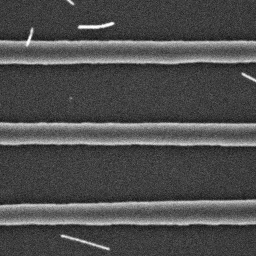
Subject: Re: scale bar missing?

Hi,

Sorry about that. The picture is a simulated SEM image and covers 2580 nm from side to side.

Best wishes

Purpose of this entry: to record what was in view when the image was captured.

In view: lines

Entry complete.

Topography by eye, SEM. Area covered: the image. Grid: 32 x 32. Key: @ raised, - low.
--------------------------------
--------------------------------
--------------------------------
--------------------------------
--------------------------------
@@@@@@@@@@@@@@@@@@@@@@@@@@@@@@@@
@@@@@@@@@@@@@@@@@@@@@@@@@@@@@@@@
@@@@@@@@@@@@@@@@@@@@@@@@@@@@@@@@
--------------------------------
--------------------------------
--------------------------------
--------------------------------
--------------------------------
--------------------------------
--------------------------------
@@@@@@@@@@@@@@@@@@@@@@@@@@@@@-@@
@@@@@@@@@@@@@@@@@@@@@@@@@@@@@@@@
@@@@@@@@@@@@@@@@@@@@@@@@@@@@@@@@
--------------------------------
--------------------------------
--------------------------------
--------------------------------
--------------------------------
--------------------------------
--------------------------------
---------@@@@@@@@@@@@@@@@@@@@@@@
@@@@@@@@@@@@@@@@@@@@@@@@@@@@@@@@
@@@@@@@@@@@@@@@@@@@@@@@@@@@@@@@@
--------------------------------
--------------------------------
--------------------------------
--------------------------------